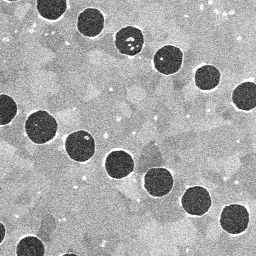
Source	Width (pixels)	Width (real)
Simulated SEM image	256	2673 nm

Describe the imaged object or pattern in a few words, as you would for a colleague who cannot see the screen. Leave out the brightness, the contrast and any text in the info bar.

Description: a regular array of holes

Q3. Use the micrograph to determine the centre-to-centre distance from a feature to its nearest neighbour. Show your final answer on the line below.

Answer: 447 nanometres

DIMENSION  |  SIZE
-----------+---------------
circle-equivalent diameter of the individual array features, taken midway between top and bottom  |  0.316 microns